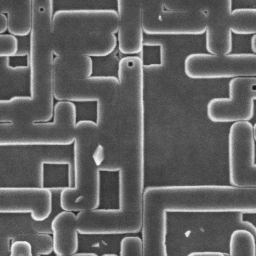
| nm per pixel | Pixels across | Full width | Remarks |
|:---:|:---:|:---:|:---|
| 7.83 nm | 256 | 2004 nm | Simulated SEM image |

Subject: wiring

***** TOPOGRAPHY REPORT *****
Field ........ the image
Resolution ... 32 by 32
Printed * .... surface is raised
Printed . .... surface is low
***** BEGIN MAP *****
*******........**************...
********************************
********************************
********************************
**..**************........***...
**..**************........***...
**..**********.**.........***...
....*******....**......*********
....*******....***.....*********
....********...***......********
....**************...........***
....**************...........***
.*****************.........*****
*********...******........******
*********...******........*****.
******************...........**.
******************...........***
******************...........***
.........*********...........***
.........*********...........***
.........*********...........***
.........****..***...........***
.........***...***...........***
.........***...***..************
******..****...*****************
******..****...*****************
....**..*************...........
.......**************...........
.......**************...........
.......***........***........**.
..**...***.....******........***
.***...***.....******........***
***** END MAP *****